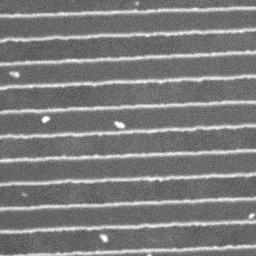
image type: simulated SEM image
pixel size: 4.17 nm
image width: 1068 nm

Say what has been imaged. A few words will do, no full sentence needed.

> lines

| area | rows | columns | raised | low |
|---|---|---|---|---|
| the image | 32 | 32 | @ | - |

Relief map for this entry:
--------------------------------
-------------@@@@@@@@@@@@@@@@@@@
@@@@@@@@@@@@@@@@@@@@@@@@@@@@@@@@
@@@@@@@@@@@@@@@@@@@@@@@@@@@@@@@@
@@@@@@@@@@@@@@------------------
--------------------------------
------------------------------@@
------------@@@@@@@@@@@@@@@@@@@@
@@@@@@@@@@@@@@@@@@@@@@@@@@@@@@@@
@@@@@@@@@@@@@@@@@@@@@@@@@@@@@@@@
@@@@@@@@@@@@@-------------------
--------------------------------
--------------------------------
-----------@@@@@@@@@@@@@@@@@@@@@
@@@@@@@@@@@@@@@@@@@@@@@@@@@@@@@@
@@@@@@@@@@@@@@@@@@@@@@@@@@@@@@@@
@@@@@@@@@@@@@@@@@-@-------------
--------------------------------
--------------------------------
-----------@@@@@@@@@@@@@@@@@@@@@
@@@@@@@@@@@@@@@@@@@@@@@@@@@@@@@@
@@@@@@@@@@@@@@@@@@@@@@@@@@@@@@@@
@@@@@@@@@@@@@@@@@@--@-----------
--------------------------------
--------------------------------
--------------@@@@@@@@@@@@@@@@@@
@@@@@@@@@@@@@@@@@@@@@@@@@@@@@@@@
@@@@@@@@@@@@@@@@@@@@@@@@@@@@@@@@
@@@@@@@@@@@@@-------------------
--------------------------------
--------------------------------
------------@@@@@@@@@@@@@@@@@@@@